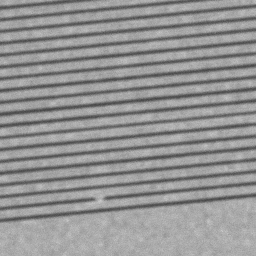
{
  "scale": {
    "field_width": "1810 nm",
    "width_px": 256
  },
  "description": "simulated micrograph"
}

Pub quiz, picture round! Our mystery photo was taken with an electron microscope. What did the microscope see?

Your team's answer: parallel lines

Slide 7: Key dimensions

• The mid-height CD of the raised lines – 7.2 px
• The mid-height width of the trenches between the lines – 31.6 nanometers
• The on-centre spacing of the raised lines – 83 nm